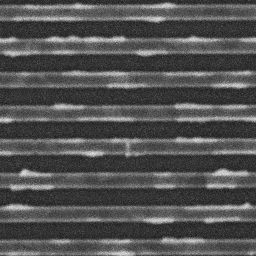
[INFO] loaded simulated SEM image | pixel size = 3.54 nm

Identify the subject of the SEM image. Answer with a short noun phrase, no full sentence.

parallel lines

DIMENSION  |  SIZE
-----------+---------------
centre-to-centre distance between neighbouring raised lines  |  0.118 µm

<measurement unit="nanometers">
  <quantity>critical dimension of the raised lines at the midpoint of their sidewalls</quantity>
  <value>50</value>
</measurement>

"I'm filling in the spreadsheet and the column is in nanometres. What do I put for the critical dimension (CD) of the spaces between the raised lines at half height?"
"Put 68.6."